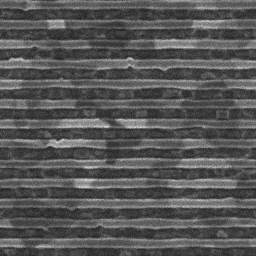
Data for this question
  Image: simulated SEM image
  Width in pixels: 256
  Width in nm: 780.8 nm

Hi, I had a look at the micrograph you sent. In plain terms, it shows parallel lines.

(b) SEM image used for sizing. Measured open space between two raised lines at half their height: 0.0363 µm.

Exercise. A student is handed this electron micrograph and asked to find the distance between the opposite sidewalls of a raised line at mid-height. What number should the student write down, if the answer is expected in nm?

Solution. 23.3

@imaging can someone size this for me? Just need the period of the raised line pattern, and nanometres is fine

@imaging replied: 60.7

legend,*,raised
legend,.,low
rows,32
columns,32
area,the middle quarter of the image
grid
********************************
................................
...........**...................
................................
********************************
********************************
................................
...............**...............
................................
********************************
********************************
................................
......*.........................
................................
********************************
********************************
................................
.......*........................
................................
********************************
********************************
....*...........................
...***..........................
................................
********************************
********************************
................................
.........................*......
................................
********************************
**********************..********
................................